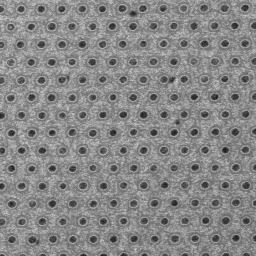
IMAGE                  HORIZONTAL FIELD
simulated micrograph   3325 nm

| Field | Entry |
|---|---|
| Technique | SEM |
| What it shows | a regular array of holes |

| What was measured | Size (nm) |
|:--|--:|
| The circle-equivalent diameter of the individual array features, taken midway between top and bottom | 100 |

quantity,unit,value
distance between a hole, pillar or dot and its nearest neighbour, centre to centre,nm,259